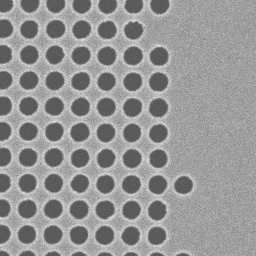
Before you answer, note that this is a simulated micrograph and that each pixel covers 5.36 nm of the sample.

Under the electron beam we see a regular array of holes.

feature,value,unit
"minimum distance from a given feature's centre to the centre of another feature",137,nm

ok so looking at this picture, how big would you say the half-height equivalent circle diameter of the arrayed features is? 99.4 nm